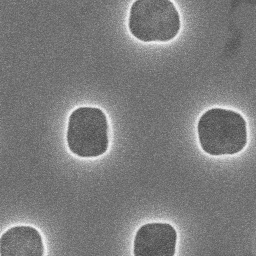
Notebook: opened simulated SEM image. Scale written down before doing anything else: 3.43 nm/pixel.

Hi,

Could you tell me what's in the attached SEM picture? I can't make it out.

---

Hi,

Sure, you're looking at holes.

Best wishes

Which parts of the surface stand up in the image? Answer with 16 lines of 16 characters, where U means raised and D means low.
UUUUUUUUDDDUUUUU
UUUUUUUUDDDUUUUU
UUUUUUUUUDDUUUUU
UUUUUUUUUUUUUUUU
UUUUUUUUUUUUUUUU
UUUUUUUUUUUUUUUU
UUUUUUUUUUUUUUUU
UUUUDDDUUUUUDDDU
UUUUDDDUUUUUDDDU
UUUUUDUUUUUUUDDU
UUUUUUUUUUUUUUUU
UUUUUUUUUUUUUUUU
UUUUUUUUUUUUUUUU
UUUUUUUUUUUUUUUU
DDUUUUUUUDDUUUUU
DDDUUUUUDDDUUUUU